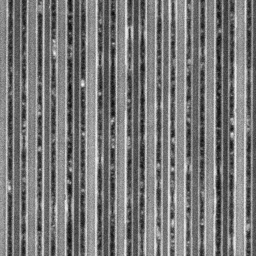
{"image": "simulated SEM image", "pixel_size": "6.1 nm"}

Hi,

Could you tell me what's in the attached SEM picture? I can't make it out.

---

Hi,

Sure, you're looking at parallel lines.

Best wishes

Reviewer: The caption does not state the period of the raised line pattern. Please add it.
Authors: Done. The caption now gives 90.9 nanometres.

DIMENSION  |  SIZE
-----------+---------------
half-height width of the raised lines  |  45 nm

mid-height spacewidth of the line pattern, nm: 45